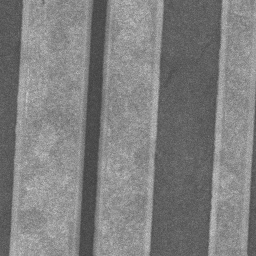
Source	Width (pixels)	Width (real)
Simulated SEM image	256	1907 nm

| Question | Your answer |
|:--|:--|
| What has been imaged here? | one or a few lines or trenches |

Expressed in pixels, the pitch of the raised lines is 89.7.